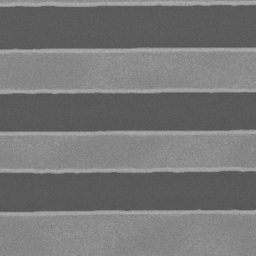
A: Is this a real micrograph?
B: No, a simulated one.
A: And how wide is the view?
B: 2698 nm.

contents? lines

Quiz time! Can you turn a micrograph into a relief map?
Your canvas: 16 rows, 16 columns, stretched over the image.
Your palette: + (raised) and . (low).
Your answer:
................
................
................
++++++++++++++++
++++++++++++++++
++++++++++++++++
................
................
++++++++++++++++
++++++++++++++++
++++++++++++++++
................
................
++++++++++++++++
++++++++++++++++
++++++++++++++++